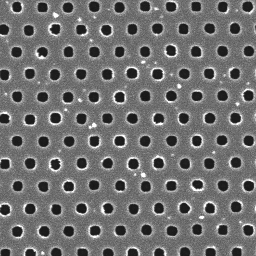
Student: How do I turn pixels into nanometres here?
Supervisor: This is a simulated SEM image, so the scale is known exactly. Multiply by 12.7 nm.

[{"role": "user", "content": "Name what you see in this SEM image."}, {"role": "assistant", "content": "a regular array of holes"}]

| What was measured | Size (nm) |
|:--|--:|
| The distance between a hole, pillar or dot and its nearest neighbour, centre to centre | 318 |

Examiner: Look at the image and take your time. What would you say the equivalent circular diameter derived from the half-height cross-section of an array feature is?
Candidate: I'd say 141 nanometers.